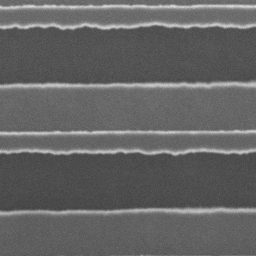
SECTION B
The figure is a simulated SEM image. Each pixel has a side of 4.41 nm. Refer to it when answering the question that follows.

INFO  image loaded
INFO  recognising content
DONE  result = lines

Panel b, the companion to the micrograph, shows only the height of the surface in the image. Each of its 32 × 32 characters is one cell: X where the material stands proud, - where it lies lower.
XXXXXXXXXXXXXXXXXXXXXXXXXXXXXXXX
XXXXXXXXXXXXXXXXXXXXXXXXXXXXXXXX
XXXXXXXXXXXXXXXXXXXXXXXXXXXXXXXX
X------XX---XXX-----------------
--------------------------------
--------------------------------
--------------------------------
--------------------------------
--------------------------------
--------------------------------
--------------------------------
XXXXXXXXXXXXXXXXXXXXXXXXXXXXXXXX
XXXXXXXXXXXXXXXXXXXXXXXXXXXXXXXX
XXXXXXXXXXXXXXXXXXXXXXXXXXXXXXXX
XXXXXXXXXXXXXXXXXXXXXXXXXXXXXXXX
XXXXXXXXXXXXXXXXXXXXXXXXXXXXXXXX
XXXXXXXXXXXXXXXXXXXXXXXXXXXXXXXX
XXXXXXXXXXXXXXXXXXXXXXXXXXXXXXXX
XXXXXXXXXXXXXXXXXXXXXXXXXXXXXXXX
--------------------------------
--------------------------------
--------------------------------
--------------------------------
--------------------------------
--------------------------------
--------------------------------
---------XX---XXXXXXXXXXXXXXXXXX
XXXXXXXXXXXXXXXXXXXXXXXXXXXXXXXX
XXXXXXXXXXXXXXXXXXXXXXXXXXXXXXXX
XXXXXXXXXXXXXXXXXXXXXXXXXXXXXXXX
XXXXXXXXXXXXXXXXXXXXXXXXXXXXXXXX
XXXXXXXXXXXXXXXXXXXXXXXXXXXXXXXX